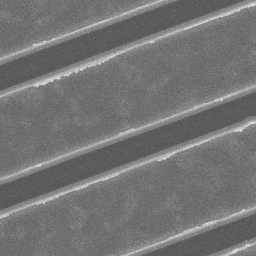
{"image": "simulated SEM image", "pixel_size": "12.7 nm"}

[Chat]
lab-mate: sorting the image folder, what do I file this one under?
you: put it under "one or a few lines or trenches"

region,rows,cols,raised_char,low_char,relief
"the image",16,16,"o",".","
ooooooooo......o
oooooo......oooo
oooo.....ooooooo
o.....oooooooooo
....oooooooooooo
.ooooooooooooooo
ooooooooooooo...
ooooooooooo.....
oooooooo.....ooo
ooooo.....oooooo
oo......oooooooo
.....ooooooooooo
..oooooooooooooo
ooooooooooooooo.
oooooooooooo....
ooooooooo......o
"